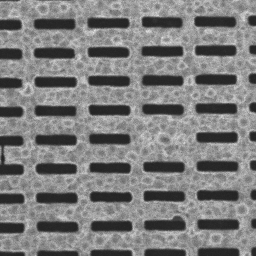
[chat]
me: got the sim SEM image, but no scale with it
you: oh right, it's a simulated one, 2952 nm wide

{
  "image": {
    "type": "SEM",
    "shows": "a regular array of holes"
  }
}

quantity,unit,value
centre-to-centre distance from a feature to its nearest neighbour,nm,333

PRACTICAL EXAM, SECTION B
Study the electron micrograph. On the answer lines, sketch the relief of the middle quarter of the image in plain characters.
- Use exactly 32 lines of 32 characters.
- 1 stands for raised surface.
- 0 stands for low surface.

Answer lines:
11111111111111111111111111111111
11111111111111111111111111111111
11111111111111111111111111111111
00011100000000001110000000000011
00011100000000000110000000000011
00011111111000001111110000000111
11111111111111111111111111111111
11111111111111111111111111111111
11111111111111111111111111111111
11111111111111111111111111111111
00011100000000001111000000000011
00011100000000000110000000000011
00011110000000001111000000000011
11111111111111111111111111111111
11111111111111111111111111111111
11111111111111111111111111111111
11111111111111111111111111111111
01111110000000001111111111111111
00011100000000000111111111111111
00011100000000000111111111111111
11111111111111111111111111111111
11111111111111111111111111111111
11111111111111111111111111111111
11111111111111111111111111111111
11111110001111111111000000000111
00011100000000000111000000000011
00011100000000000111000000000011
00011111111111001111111111111111
11111111111111111111111111111111
11111111111111111111111111111111
11111111111111111111111111111111
11111111111111111111111111111111